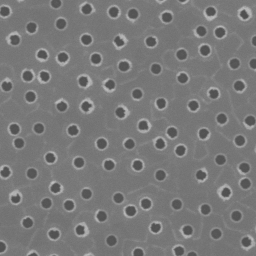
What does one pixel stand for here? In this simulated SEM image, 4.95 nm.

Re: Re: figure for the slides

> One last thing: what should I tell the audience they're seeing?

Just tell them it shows a regular array of holes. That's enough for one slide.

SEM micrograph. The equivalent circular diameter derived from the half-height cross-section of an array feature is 53.2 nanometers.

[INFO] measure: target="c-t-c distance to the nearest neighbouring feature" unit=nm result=115